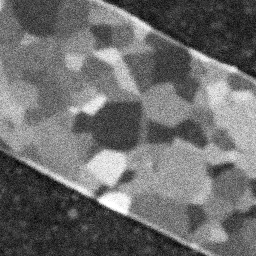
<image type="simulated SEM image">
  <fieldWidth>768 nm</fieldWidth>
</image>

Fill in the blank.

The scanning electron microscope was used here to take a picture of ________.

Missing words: one or a few lines or trenches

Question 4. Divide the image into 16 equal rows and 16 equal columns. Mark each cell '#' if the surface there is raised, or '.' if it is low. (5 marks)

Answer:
#######.........
#########.......
###########.....
#############...
###############.
################
################
################
################
################
..##############
....############
......##########
........########
..........######
............####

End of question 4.